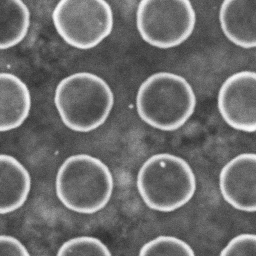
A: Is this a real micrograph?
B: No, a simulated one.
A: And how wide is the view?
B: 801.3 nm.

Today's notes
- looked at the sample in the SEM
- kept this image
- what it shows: raised bodies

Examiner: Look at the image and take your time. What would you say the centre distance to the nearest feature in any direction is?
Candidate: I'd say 0.256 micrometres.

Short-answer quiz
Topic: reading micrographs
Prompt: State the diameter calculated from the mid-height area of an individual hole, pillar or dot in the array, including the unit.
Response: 174 nanometers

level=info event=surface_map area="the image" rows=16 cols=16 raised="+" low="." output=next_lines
++..+++..+++..++
++..+++..+++..++
+...++...++....+
................
................
++..+++..+++..++
++..+++..+++..++
+...++...+++..++
................
................
+...+++..+++..++
++..+++..+++..++
+...+++..+++..++
................
................
+...+++..+++..++